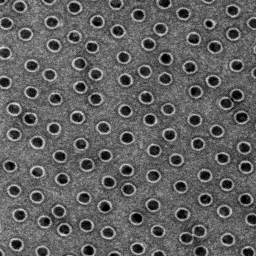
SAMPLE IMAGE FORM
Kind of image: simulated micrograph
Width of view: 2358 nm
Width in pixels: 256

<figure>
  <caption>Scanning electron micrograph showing a regular array of raised bodies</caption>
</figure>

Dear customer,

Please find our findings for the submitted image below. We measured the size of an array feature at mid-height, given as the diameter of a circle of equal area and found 0.115 micrometres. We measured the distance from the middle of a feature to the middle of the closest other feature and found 205 nanometers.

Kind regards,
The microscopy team